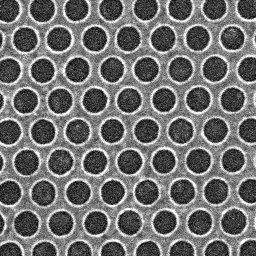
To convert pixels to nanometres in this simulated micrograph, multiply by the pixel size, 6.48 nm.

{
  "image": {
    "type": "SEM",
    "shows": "a regular array of holes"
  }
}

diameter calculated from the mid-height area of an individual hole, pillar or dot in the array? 168 nm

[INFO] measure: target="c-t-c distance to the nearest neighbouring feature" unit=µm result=0.222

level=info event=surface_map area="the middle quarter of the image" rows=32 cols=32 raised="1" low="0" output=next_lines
00000011100000011100000011000000
00000001100000011000000011000000
00000011100000011100000011000000
10000011110000111100000111100001
11000111111001111111011111110011
11111111111111111111111111111111
01111100001111100011111000011111
00111000001111000001110000001110
00111000000110000001110000001100
00110000000110000001110000001100
00111000000110000001110000001110
01111000001111000011111000011111
11111111111111111111111111111111
11111111111111111111111111110011
10000111110000111100000111100000
10000011100000011100000011000000
00000001100000011000000011000000
00000001100000011000000011000000
10000011110000011100000111100000
11000111111000111110001111110001
11111111111111111111111111111111
11111110011111100011111100011111
00111000001111000001111000011110
00111000000110000000110000001100
00111000000110000000110000001100
00111000000110000000110000001110
00111000001111000001111000011110
01111100011111100011111101111111
11111111111111111111111111111111
11000111110000111110000111100000
10000011100000011100000111100000
00000001100000011100000011000000